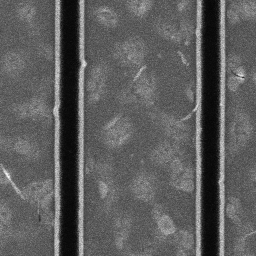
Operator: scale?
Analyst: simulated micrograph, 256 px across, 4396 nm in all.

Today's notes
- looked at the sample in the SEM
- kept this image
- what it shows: one or a few lines or trenches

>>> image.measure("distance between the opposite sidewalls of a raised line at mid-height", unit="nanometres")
423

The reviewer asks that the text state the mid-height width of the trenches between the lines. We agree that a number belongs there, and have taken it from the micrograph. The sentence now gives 1990 nanometers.